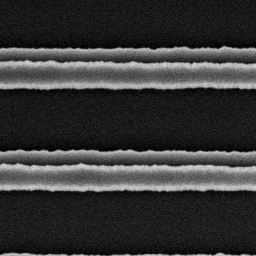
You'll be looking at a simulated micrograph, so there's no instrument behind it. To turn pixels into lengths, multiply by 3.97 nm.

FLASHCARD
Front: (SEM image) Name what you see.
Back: lines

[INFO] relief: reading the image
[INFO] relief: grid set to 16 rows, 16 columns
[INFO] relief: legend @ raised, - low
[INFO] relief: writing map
----------------
----------------
----------------
@@@@@@@@@@@@@@@@
@@@@@@@@@@@@@@@@
@-@@---@@-@----@
----------------
----------------
----------------
@@@@@@@@@@@@@@--
@@@@@@@@@@@@@@@@
@@@@@@@@@@@@@@@@
----------------
----------------
----------------
----------------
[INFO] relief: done